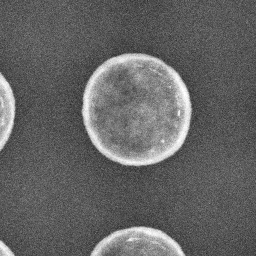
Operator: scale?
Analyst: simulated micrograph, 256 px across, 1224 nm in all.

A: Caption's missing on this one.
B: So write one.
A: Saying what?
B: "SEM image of raised bodies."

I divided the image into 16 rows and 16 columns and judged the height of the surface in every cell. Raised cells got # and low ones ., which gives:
................
................
................
........#.......
......#####.....
#.....#####.....
#....#######....
#....#######....
......#####.....
.......####.....
................
................
................
................
........##......
......#####.....